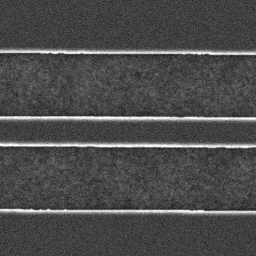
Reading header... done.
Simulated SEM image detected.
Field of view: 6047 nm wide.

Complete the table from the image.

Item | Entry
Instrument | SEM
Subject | lines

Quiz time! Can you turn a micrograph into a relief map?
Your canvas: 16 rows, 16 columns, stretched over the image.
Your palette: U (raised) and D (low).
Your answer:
UUUUUUUUUUUUUUUU
UUUUUUUUUUUUUUUU
UUUUUUUUUUUUUUUU
DDDDDDDDDDDDDDDD
DDDDDDDDDDDDDDDD
DDDDDDDDDDDDDDDD
DDDDDDDDDDDDDDDD
UUUUUUUUUUUUUUUU
UUUUUUUUUUUUUUUU
DDDDDDDDDDDDDDDD
DDDDDDDDDDDDDDDD
DDDDDDDDDDDDDDDD
DDDDDDDDDDDDDDDD
UUUUUUUUUUUUUUUU
UUUUUUUUUUUUUUUU
UUUUUUUUUUUUUUUU